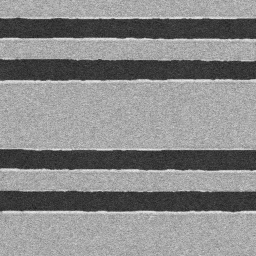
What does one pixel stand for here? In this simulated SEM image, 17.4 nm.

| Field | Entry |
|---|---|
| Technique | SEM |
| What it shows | lines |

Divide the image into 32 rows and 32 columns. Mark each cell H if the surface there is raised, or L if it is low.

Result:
HHHHHHHHHHHHHHHHHHHHHHHHHHHHHHHH
HHHHHHHHHHHHHHHHHHHHHHHHHHHHHHHH
LLLLLLLLLLLLLLLLLLLLLLLLLLLLLLLL
LLLLLLLLLLLLLLLLLLLLLLLLLLLLLLLL
LLLLLLLLLLLLLLLLLLLLLLLLLLLLLLLL
HHHHHHHHHHHHHHHHHHHHHHHHHHHHHHHH
HHHHHHHHHHHHHHHHHHHHHHHHHHHHHHHH
LLLLLLLLLLLLLLLLLLLLLLLLLHHHHHHH
LLLLLLLLLLLLLLLLLLLLLLLLLLLLLLLL
LLLLLLLLLLLLLLLLLLLLLLLLLLLLLLLL
HHHHHHHHHHHHHHHHHHHHHHHHHHHHHHHH
HHHHHHHHHHHHHHHHHHHHHHHHHHHHHHHH
HHHHHHHHHHHHHHHHHHHHHHHHHHHHHHHH
HHHHHHHHHHHHHHHHHHHHHHHHHHHHHHHH
HHHHHHHHHHHHHHHHHHHHHHHHHHHHHHHH
HHHHHHHHHHHHHHHHHHHHHHHHHHHHHHHH
HHHHHHHHHHHHHHHHHHHHHHHHHHHHHHHH
HHHHHHHHHHHHHHHHHHHHHHHHHHHHHHHH
HHHHHHHHHHHHHHHHHHHHHHHHHHHHHHHH
LLLLLLLLLLLLLLLLLLLLLLLLLLLLLLLL
LLLLLLLLLLLLLLLLLLLLLLLLLLLLLLLL
HHHHHHHHHHHHHHHHHHHHHHHHHHHHHHHH
HHHHHHHHHHHHHHHHHHHHHHHHHHHHHHHH
HHHHHHHHHHHHHHHHHHHHHHHHHHHHHHHH
LLLLLLLLLLLLLLLLLLLLLLLLLLLLLLLL
LLLLLLLLLLLLLLLLLLLLLLLLLLLLLLLL
LLLLLLLLLLLLLLLLLLLLLLLLLLLLLLLL
HHHHHHHHHHHHHHHHHHHHHHHHHHHHHHHH
HHHHHHHHHHHHHHHHHHHHHHHHHHHHHHHH
HHHHHHHHHHHHHHHHHHHHHHHHHHHHHHHH
HHHHHHHHHHHHHHHHHHHHHHHHHHHHHHHH
HHHHHHHHHHHHHHHHHHHHHHHHHHHHHHHH